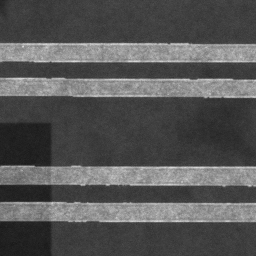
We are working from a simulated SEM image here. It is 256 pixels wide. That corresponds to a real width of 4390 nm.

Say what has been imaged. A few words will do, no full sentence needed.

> lines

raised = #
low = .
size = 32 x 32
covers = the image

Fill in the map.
................................
................................
................................
................................
................................
######...##.....##...##.........
################################
################################
................................
................................
################################
################################
................................
................................
................................
................................
................................
................................
................................
................................
................................
################################
################################
................................
................................
################################
################################
################################
................................
................................
................................
................................